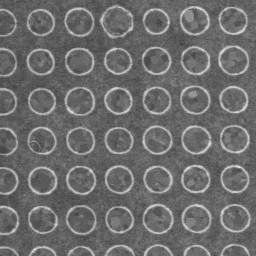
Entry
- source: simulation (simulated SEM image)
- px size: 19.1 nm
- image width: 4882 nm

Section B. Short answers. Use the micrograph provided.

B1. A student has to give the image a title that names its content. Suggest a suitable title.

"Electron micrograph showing a regular array of raised bodies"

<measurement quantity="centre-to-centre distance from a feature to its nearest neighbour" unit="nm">727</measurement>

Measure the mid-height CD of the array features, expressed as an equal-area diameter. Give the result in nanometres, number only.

514